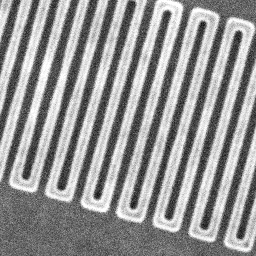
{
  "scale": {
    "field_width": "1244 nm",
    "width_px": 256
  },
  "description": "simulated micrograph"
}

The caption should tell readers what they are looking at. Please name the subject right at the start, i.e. groups of lines, slits or small figures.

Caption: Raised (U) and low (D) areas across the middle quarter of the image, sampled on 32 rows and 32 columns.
UDDDUUDDDUUDDDUUDDDUUDDDUUDDUUDD
UDDDUUDDDUUDDUUUDDUUDDDUUDDDUUDD
UDDDUUDDDUUDDUUDDDUUDDDUUDDDUUDD
DDDDUDDDUUDDDUUDDDUUDDDUUDDDUUDD
DDDUUDDDUUDDDUUDDDUUDDUUDDDUUDDD
DDDUUDDDUUDDDUUDDUUDDDUUDDDUUDDD
DDDUUDDDUDDDUUDDDUUDDDUUDDDUUDDD
DDUUDDDUUDDDUUDDDUUDDDUUDDUUDDDU
DDUUDDDUUDDDUUDDDUUDDUUDDDUUDDDU
DDUUDDDUUDDUUDDDUUDDDUUDDDUUDDDU
DUUUDDUUDDDUUDDDUUDDDUUDDDUUDDUU
DUUDDDUUDDDUUDDDUUDDDUUDDUUDDDUU
DUUDDDUUDDDUUDDUUDDDUUDDDUUDDDUU
DUUDDUUUDDUUDDDUUDDDUUDDDUUDDDUU
UUUDDUUDDDUUDDDUUDDDUUDDUUDDDUUD
UUDDDUUDDDUUDDDUUDDUUDDDUUDDDUUD
UUDDUUUDDDUDDDUUDDDUUDDDUUDDDUUD
UUDDUUDDDUUDDDUUDDDUUDDDUUDDUUUD
UUDDUUDDDUUDDDUUDDDUDDDUUUDDUUDD
UDDDUUDDDUUDDUUDDDUUDDDUUDDDUUDD
UDDUUUDDUUDDDUUDDDUUDDDUUDDDUUDD
UDDUUDDDUUDDDUUDDDUUDDUUUDDUUUDD
DDDUUDDDUUDDDUUDDUUDDDUUDDDUUDDD
DDDUUDDDUUDDUUDDDUUDDDUUDDUUUDDD
DDUUDDDUUDDDUUDDDUUDDDUUDDUUUDDU
DDUUDDDUUDDDUUDDDUUDDUUUDDUUDDDU
DDUUDDDUUDDDUUDDUUUDDUUDDDUUDDDU
DDUUDDUUUDDUUDDDUUDDDUUDDDUUDDUU
DUUDDDUUDDDUUDDDUUDDDUUDDUUUDDUU
DUUDDDUUDDDUUDDUUUDDUUDDDUUDDDUU
DUUDDDUUDDUUUDDUUDDDUUDDDUUDDDUU
UUDDDUUDDDUUDDDUUDDDUUDDUUUDDUUD